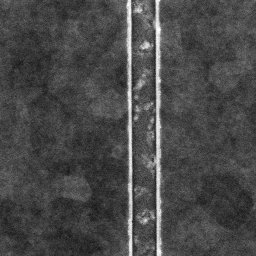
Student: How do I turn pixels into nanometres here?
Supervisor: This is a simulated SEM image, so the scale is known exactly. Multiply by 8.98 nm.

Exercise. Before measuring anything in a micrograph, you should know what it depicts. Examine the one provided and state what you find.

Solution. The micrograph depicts one or a few lines or trenches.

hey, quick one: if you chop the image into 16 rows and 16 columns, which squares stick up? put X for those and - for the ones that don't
XXXXXXXX--XXXXXX
XXXXXXXX--XXXXXX
XXXXXXXX--XXXXXX
XXXXXXXX--XXXXXX
XXXXXXXX--XXXXXX
XXXXXXXX--XXXXXX
XXXXXXXX--XXXXXX
XXXXXXXX--XXXXXX
XXXXXXXX--XXXXXX
XXXXXXXX--XXXXXX
XXXXXXXX--XXXXXX
XXXXXXXX--XXXXXX
XXXXXXXX--XXXXXX
XXXXXXXX--XXXXXX
XXXXXXXX--XXXXXX
XXXXXXXX--XXXXXX